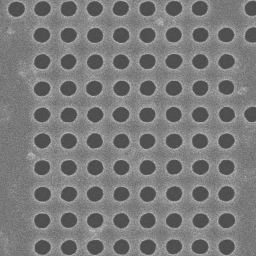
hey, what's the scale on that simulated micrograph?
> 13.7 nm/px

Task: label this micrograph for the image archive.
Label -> a regular array of holes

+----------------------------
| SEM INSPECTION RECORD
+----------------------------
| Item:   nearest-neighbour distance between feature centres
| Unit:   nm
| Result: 356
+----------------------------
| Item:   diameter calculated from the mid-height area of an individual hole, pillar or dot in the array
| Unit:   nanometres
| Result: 217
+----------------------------